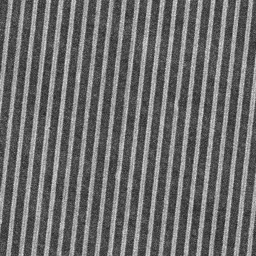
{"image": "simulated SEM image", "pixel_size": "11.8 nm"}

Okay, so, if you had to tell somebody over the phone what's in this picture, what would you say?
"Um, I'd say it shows parallel lines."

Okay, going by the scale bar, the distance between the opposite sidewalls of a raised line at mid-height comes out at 40.9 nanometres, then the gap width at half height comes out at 111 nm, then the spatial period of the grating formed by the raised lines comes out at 148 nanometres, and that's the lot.